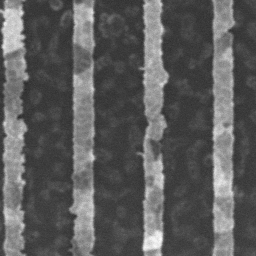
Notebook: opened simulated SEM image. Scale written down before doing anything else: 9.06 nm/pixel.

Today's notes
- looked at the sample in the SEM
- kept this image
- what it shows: one or a few lines or trenches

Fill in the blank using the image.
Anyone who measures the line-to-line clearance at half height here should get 476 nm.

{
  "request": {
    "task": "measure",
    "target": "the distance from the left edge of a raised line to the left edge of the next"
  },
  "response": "633 nm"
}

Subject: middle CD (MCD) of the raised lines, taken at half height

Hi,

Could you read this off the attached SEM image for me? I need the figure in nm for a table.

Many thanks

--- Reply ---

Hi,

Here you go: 161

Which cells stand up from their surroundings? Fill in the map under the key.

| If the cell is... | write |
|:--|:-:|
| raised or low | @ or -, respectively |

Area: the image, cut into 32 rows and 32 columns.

-@@------@@@------@@-------@@---
-@@------@@@------@@-------@@---
-@@------@@@------@@-------@@---
@@@------@@@------@@-------@@---
@@@------@@@------@@-------@@---
@@@------@@@------@@-------@@---
-@@------@@@------@@-------@@---
-@@------@@@------@@-------@@---
-@@------@@@------@@-------@@---
-@@------@@@------@@@------@@---
-@@------@@@------@@@------@@---
-@@------@@@------@@-------@@---
-@@------@@@------@@-------@@---
-@@------@@@------@@-------@@---
-@-------@@@------@@-------@@---
-@@------@@@-------@@------@@---
-@@------@@@------@@-------@@---
-@@------@@@------@@-------@@---
-@@------@@@------@@-------@@---
@@@------@@@------@@-------@@---
-@@------@@-------@@-------@@---
-@@------@@@------@@-------@@---
-@@------@@@------@@-------@@---
-@@------@@@------@@-------@@---
-@@------@@@------@@-------@@---
-@-------@@@------@@-------@@---
-@@------@@@------@@-------@@---
-@@-------@@------@@-------@@---
-@@------@@@------@@-------@@---
-@@------@@@------@@-------@@---
-@@------@@@------@@-------@@---
-@@------@@-------@@-------@@---